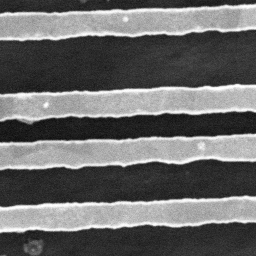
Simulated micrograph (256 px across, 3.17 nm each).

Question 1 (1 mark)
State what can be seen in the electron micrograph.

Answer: lines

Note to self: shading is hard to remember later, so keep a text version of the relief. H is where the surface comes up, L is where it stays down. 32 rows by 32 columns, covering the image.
LLLLLLLLLLLLLLLLLLLLLLLLLLLLLLLL
LLLLLLLLLLLLLHHHHHHHHHHHHHHHHHHH
HHHHHHHHHHHHHHHHHHHHHHHHHHHHHHHH
HHHHHHHHHHHHHHHHHHHHHHHHHHHHHHHH
HHHHHHHHHHLLLLLLHLLLLLLLLLLLLLLL
LLLLLLLLLLLLLLLLLLLLLLLLLLLLLLLL
LLLLLLLLLLLLLLLLLLLLLLLLLLLLLLLL
LLLLLLLLLLLLLLLLLLLLLLLLLLLLLLLL
LLLLLLLLLLLLLLLLLLLLLLLLLLLLLLLL
LLLLLLLLLLLLLLLLLLLLLLLLLLLLLLLL
LLLLLLLLLLLLLLLLLLLLLLLLLLLLLLLL
LLLLLLLLLHLLLHHHHHHHHHHHHHHHHHHH
HHHHHHHHHHHHHHHHHHHHHHHHHHHHHHHH
HHHHHHHHHHHHHHHHHHHHHHHHHHHHHHHH
HHHHHHHHLLHHHLHLLLLLLLLLLLLLLLLL
LLLLLLLLLLLLLLLLLLLLLLLLLLLLLLLL
LLLLLLLLLLLLLLLLLLLLLLLLLLLLLLLL
LLLLLLLLLLLLLLLLLHHHHHHHHHHHHHHH
HHHHHHHHHHHHHHHHHHHHHHHHHHHHHHHH
HHHHHHHHHHHHHHHHHHHHHHHHHHHHHHHH
HHHHHHHHHHHHHHHHHLLLLLLLLLLLLLLL
LLLLLLLLLLLLLLLLLLLLLLLLLLLLLLLL
LLLLLLLLLLLLLLLLLLLLLLLLLLLLLLLL
LLLLLLLLLLLLLLLLLLLLLLLLLLLLLLLL
LLLLLLLLLLLLLLLLLLLLLLLLLLLLLLLL
LLLLLLLLLLLHLLHHHHHHHHHHHHHHHHHH
HHHHHHHHHHHHHHHHHHHHHHHHHHHHHHHH
HHHHHHHHHHHHHHHHHHHHHHHHHHHHHHHH
HHHHHHHHHHHLLLLLLLLLLLLLLLLLLLLL
LLLLLLLLLLLLLLLLLLLLLLLLLLLLLLLL
LLLLLLLLLLLLLLLLLLLLLLLLLLLLLLLL
LLLLLLLLLLLLLLLLLLLLLLLLLLLLLLLL